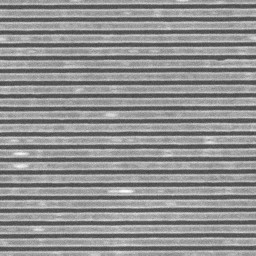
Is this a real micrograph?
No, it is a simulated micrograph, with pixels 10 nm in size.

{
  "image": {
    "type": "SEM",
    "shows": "parallel lines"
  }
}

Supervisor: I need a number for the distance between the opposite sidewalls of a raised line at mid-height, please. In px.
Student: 7.38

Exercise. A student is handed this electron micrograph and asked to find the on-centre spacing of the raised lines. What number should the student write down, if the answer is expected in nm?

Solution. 128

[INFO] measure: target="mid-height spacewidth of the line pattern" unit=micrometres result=0.0551